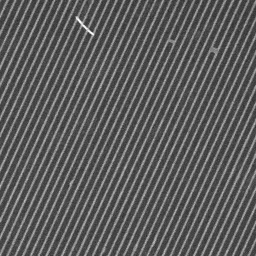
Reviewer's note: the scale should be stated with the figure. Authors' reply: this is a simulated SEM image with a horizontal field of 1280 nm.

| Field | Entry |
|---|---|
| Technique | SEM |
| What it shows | parallel lines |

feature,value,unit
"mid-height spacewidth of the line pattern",27.3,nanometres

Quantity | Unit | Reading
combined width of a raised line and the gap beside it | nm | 35.3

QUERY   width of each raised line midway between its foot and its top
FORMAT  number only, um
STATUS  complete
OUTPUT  0.0073